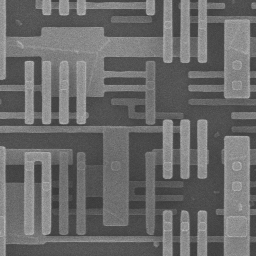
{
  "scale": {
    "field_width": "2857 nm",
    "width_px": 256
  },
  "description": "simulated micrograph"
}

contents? wiring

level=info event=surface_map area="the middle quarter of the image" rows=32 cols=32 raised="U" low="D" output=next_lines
UDDUUDDDDDDDDDDDDDDDDUUDDDDDDDDD
UDDUUDDDDDDDDDDDDDDDDUUDDDDDDDDD
UDDUUDDDDDDDDDDDDDDDDUUDDDDDDDDD
UDDUUDDDDDDDDDDDDDDDDUUDDDDDDDDD
UDDUUDDDDDDDDDDDDDDDDUUDDDDDDDDD
UDDUUDDDDDDDDDDDDDDDDUUDDDDDDDDD
UDDUUDDDDDDDDDDDDDDDDUUDDDDDDDDD
UDDUUDDDDDDDDDDDDDDDDUUDDDDDDDDD
UDDUUDDDDDDDDDDDDDDDDUUDDDDDDDDD
UDDUUDDDDDDDDDDDDDDDDUUDDDDDDDDD
UDDUUDDDDDDDDDDDDDDDDUUDDDDDDDDD
UDDUUDDDDDDDDDDDDDDDDUUDDDDDDDDD
UDDUUDDDDDDDDDDDDDDDDUUDDDDDDDDD
UDDUUDDDDDDDDDDDDDDDDUUDDDDDDDDD
UDDUUDDDDDDDDDDDDDDDDUUDDUUDDUUD
DDDDDDDDDDDDDDDDDDDDDDDDDUUDDUUD
DDDDDDDDDDUUUUUUDDDDDDDDDUUDDUUD
DDDDDDDDDDUUUUUUDDDDDDDDDUUDDUUD
DDDDDDDDDDUUUUUUDDDDDDDDDUUDDUUD
DDDDDDDDDDUUUUUUDDDDDDDDDUUDDUUD
DDDDDDDDDDUUUUUUDDDDDDDDDUUDDUUD
DDDDDDDDDDUUUUUUDDDDDDDDDUUDDUUD
UDDUUDDDDDUUUUUUDDDDUUUDDUUDDUUD
UDDUUDDDDDUUUUUUDDDDUUUDDUUDDUUD
UDDUUDDDDDUUUUUUDDDDDUUDDUUDDUUD
UDDUUDDDDDUUUUUUDDDDDUUDDUUDDUUD
UDDUUDDDDDUUUUUUDDDDDUUDDUUDDUUD
UDDUUDDDDDUUUUUUDDDDDUUDDUUDDUUD
UDDUUDDDDDUUUUUUDDDDDUUDDUUDDDUD
UDDUUDDDDDUUUUUUDDDDDUUDDDDDDDDD
UDDUUDDDDDUUUUUUDDDDDUUDDDDDDDDD
UDDUUDDDDDUUUUUUDDDDDUUDDDDDDDDD